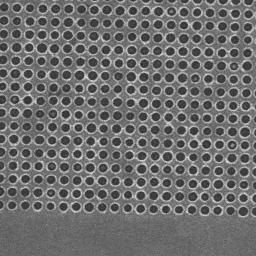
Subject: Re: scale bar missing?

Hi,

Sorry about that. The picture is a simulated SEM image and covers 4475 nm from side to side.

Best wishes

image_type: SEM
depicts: a regular array of holes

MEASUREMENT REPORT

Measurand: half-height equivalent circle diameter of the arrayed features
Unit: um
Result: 0.159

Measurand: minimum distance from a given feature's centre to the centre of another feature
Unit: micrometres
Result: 0.222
